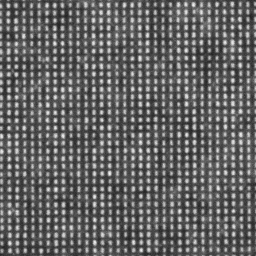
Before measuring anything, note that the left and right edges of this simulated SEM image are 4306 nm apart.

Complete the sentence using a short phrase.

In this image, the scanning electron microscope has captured a regular array of raised bodies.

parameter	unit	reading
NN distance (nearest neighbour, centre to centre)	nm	120